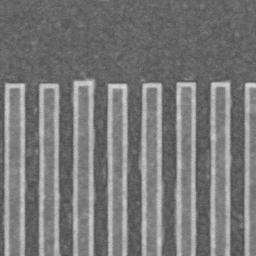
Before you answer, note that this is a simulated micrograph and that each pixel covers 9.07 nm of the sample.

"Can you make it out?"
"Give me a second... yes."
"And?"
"parallel lines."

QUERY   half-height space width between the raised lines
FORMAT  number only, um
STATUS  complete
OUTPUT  0.172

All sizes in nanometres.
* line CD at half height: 134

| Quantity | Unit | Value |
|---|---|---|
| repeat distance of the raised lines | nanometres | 311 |